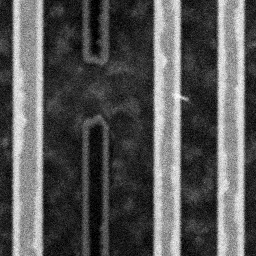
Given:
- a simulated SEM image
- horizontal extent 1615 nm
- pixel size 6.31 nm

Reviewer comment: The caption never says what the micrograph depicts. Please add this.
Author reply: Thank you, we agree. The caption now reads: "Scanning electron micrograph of one or a few lines or trenches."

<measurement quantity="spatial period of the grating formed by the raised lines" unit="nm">427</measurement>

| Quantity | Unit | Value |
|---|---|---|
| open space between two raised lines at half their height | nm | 286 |